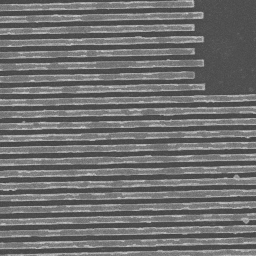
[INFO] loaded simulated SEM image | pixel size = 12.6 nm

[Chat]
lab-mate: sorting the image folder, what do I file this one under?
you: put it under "parallel lines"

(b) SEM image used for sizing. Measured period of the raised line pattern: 150 nanometers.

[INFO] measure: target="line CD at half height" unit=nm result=77.4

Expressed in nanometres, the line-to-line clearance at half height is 66.3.